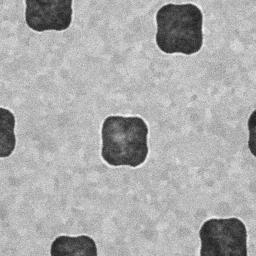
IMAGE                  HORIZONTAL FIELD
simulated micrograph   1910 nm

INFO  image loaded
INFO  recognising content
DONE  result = holes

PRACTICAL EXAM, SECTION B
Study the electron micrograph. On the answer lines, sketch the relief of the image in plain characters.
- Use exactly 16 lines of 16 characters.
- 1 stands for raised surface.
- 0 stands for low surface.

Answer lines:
1100011111001111
1100111111000111
1111111111000111
1111111111111111
1111111111111111
1111111111111111
1111111111111111
0111111001111111
0111110001111111
0111110001111111
1111111111111111
1111111111111111
1111111111111111
1111111111111111
1111111111110001
1110001111110001